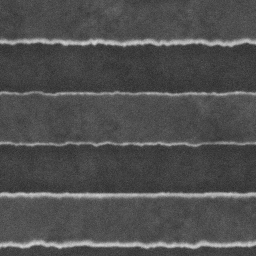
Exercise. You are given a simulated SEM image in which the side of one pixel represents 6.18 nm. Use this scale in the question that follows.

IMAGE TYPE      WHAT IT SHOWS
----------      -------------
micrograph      lines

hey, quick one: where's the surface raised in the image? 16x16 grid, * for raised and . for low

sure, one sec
****************
****************
****************
................
................
................
****************
****************
****************
................
................
................
****************
****************
****************
................